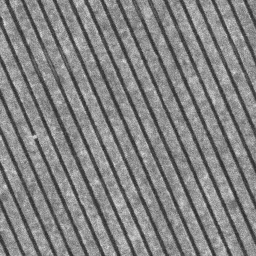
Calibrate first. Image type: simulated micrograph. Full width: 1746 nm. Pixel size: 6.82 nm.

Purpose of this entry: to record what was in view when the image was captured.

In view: parallel lines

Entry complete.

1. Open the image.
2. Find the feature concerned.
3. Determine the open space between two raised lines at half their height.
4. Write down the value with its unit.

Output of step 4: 0.0289 um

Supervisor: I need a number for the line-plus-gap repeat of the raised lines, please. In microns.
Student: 0.0992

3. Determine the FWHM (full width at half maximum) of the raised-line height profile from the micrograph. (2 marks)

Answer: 70.2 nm